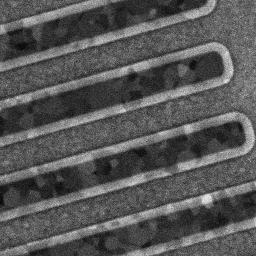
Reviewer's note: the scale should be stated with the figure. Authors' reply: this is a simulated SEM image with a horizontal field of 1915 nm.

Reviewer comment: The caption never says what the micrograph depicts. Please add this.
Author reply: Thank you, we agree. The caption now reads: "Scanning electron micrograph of one or a few lines or trenches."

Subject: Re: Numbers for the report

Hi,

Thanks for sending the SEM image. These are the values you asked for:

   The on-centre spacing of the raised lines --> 540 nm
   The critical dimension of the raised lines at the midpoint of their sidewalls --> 278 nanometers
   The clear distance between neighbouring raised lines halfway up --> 263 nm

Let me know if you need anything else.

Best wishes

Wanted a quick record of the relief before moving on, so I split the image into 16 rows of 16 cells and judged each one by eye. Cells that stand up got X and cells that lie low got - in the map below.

-----XXXXXXXX---
-XXXXXXXXX------
XXXXXX----------
XXX--------XXX--
-------XXXXXXX--
----XXXXXXXXX---
XXXXXXXXX-------
XXXXX---------X-
XX--------XXXXXX
------XXXXXXXXX-
---XXXXXXXX-----
XXXXXXXX--------
XXXX--------XXXX
---------XXXXXXX
-----XXXXXXXXX--
--XXXXXXXX------